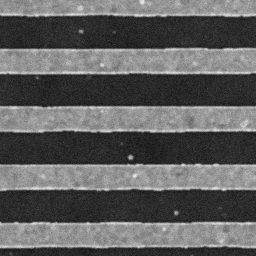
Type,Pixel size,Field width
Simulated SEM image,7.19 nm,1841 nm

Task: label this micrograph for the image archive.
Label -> lines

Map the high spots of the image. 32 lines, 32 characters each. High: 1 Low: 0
11111111111111111111111111111111
11111111111111111111111111111111
00000000000000000000000000000000
00000000000000000000000000000000
00000000000000000000000000000000
00000000000000000000000000000000
11111111111111111111111111111111
11111111111111111111111111111111
11111111111111111111111111111111
00000000000000000000000000000000
00000000000000000000000000000000
00000000000000000000000000000000
00000000000000000000000000000000
11111111111111111111111111111111
11111111111111111111111111111111
11111111111111111111111111111111
00000000000000000000000000000000
00000000000000000000000000000000
00000000000000000000000000000000
00000000000000000000000000000000
00000000000000000000000000000000
11111111111111111111111111111111
11111111111111111111111111111111
11111111111111111111111111111111
00000000000000000000000000000000
00000000000000000000000000000000
00000000000000000000000000000000
00000000000000000000000000000000
11111111111111111111111111111111
11111111111111111111111111111111
11111111111111111111111111111111
00000000000000000000000000000000